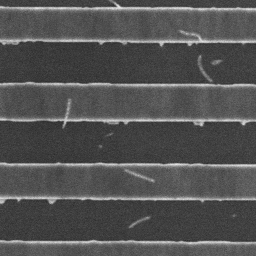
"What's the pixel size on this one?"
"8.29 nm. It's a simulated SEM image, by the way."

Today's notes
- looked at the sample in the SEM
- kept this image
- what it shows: lines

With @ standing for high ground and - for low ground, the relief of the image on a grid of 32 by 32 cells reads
--------------------------------
@@@@@@@@@@@@@@@@@@@@@@@@@@@@@@@@
@@@@@@@@@@@@@@@@@@@@@@@@@@@@@@@@
@@@@@@@@@@@@@@@@@@@@@@@@@@@@@@@@
@@@@@@@@@@@@@@@@@@@@@@@@@@@@@@@@
--------------------------------
--------------------------------
--------------------------------
--------------------------------
--------------------------------
@@@@@@@@@@-@@@------------------
@@@@@@@@@@@@@@@@@@@@@@@@@@@@@@@@
@@@@@@@@@@@@@@@@@@@@@@@@@@@@@@@@
@@@@@@@@@@@@@@@@@@@@@@@@@@@@@@@@
@@@@@@@@@@@@@@@@@@@@@@@@@@@@@@@@
--------------------------------
--------------------------------
--------------------------------
--------------------------------
--------------------------------
@------@------------------------
@@@@@@@@@@@@@@@@@@@@@@@@@@@@@@@@
@@@@@@@@@@@@@@@@@@@@@@@@@@@@@@@@
@@@@@@@@@@@@@@@@@@@@@@@@@@@@@@@@
@@@@@@@@@@@@@@@@@@@@@@@@@@@@@@@@
--------------------------------
--------------------------------
--------------------------------
--------------------------------
--------------------------------
@@@@@@@@@@@@@@@@@@@@@@@@@@@@@@@@
@@@@@@@@@@@@@@@@@@@@@@@@@@@@@@@@